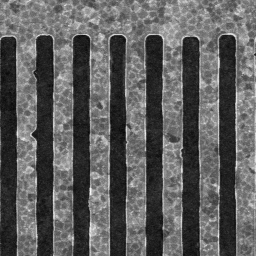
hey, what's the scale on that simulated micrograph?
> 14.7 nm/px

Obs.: parallel lines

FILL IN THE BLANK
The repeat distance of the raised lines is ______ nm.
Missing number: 538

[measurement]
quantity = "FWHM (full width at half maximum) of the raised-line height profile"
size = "0.274 microns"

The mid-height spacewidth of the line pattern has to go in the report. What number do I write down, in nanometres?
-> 261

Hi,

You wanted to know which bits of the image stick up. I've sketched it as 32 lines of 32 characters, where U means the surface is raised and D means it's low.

UUUUUUUUUUUUUUUUUUUUUUUUUUUUUUUU
UUUUUUUUUUUUUUUUUUUUUUUUUUUUUUUU
UUUUUUUUUUUUUUUUUUUUUUUUUUUUUUUU
UUUUUUUUUUUUUUUUUUUUUUUUUUUUUUUU
UUUUUDUUUDDUUUDUUUUDUUUUUUUUDUUU
DDUUDDDUUDDUUUDDUUDDDUUDDUUDDDUU
DDUUDDDUUDDUUUDDUUDDUUUDDUUDDDUU
DDUUDDDUUDDUUUDDUUDDUUUDDUUDDDUU
DDUUDDDUUDDUUUDDUUDDUUUDDUUDDDUU
DDUUDDDUUDDUUUDDUUDDUUUDDUUDDDUU
DDUUUDDUUDDUUUDDUUDDUUUDDUUDDDUU
DDUUDDDUUDDUUUDDUUDDUUUDDUUDDDUU
DDUUDDDUUDDUUUDDUUDDUUUDDUUDDDUU
DDUUUDDUUDDUUUDDUUDDUUUDDUUDDDUU
DDUUUDDUUDDUUUDDUUDDUUUDDUUDDDUU
DDUUUDDUUDDUUUDDUUDDUUUDDUUDDDUU
DDUUDDDUUDDUUUDDUUDDUUUDDUUDDDUU
DDUUDDDUUDDUUUDDUUDDUUUDDUUDDDUU
DDUUDDDUUDDUUUDDUUDDUUUDDUUDDDUU
DDUUDDDUUDDUUUDDUUDDUUUDDUUDDDUU
DDUUDDDUUDDUUUDDUUDDUUUDDUUDDDUU
DDUUDDDUUDDUUUDDUUDDUUUDDUUDDUUU
DDUUDDDUUDDUUUDDUUDDUUUDDUUDDUUU
DDUUDDDUUDDUUUDDUUDDUUUDDUUDDUUU
DDUUDDDUUDDUUUDDUUDDUUUDDUUDDDUU
DDUUDDDUUDDUUUDDUUDDUUUDDUUDDDUU
DDUUDDDUUDDUUUDDUUDDUUUDDUUDDDUU
DDUUDDDUUDDUUUDDUUDDUUUDDUUDDDUU
DDUUUDDUUDDUUUDDUUDDUUUDDUUDDDUU
DDUUUDDUUDDUUUDDUUDDUUUDDUUDDDUU
DDUUUDDUUDDUUUDDUUDDUUUDDUUDDDUU
DDUUUDDUUDDUUUDDUUDDUUUDDUUDDDUU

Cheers